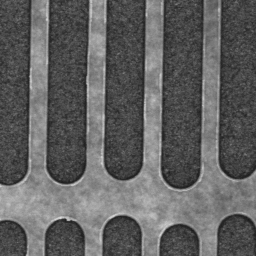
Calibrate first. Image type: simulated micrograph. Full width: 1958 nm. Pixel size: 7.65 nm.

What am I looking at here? parallel lines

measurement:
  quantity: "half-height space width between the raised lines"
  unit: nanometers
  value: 308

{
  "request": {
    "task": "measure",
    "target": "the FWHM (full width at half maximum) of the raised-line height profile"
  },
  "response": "130 nm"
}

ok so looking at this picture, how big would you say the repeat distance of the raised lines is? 440 nm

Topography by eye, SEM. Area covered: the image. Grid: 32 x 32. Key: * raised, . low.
....**.....**.....**......**....
....**.....**.....**......**....
....**.....**.....**......**....
....**.....**.....**.....***....
....**.....**.....**.....**.....
....**.....**.....**.....**.....
....**.....**.....**.....**.....
....**.....**.....**.....**.....
....**.....**.....**.....**.....
....**.....**.....**.....**.....
....**.....**.....**.....**.....
....**.....**.....**.....**.....
....**.....**.....**.....**.....
....**.....**.....**.....**.....
....**.....**.....**.....**.....
....**.....**.....**.....**.....
....**.....**.....**.....**.....
....**.....**.....**.....**.....
....**.....**.....**.....**.....
....**.....**.....**.....**.....
....**.....**.....**.....**.....
...***.....**.....**.....***....
...****...*****.****.....*******
**********************..********
********************************
********************************
********************************
*******..*****...***********...*
...***....***.....***...***.....
...***.....**.....**.....**.....
...**......**.....**.....**.....
...**......**.....**.....**.....